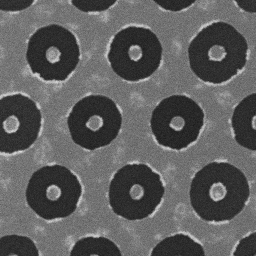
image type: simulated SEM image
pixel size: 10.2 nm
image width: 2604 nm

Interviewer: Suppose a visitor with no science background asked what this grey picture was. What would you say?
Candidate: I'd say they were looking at a regular array of ring-shaped grooves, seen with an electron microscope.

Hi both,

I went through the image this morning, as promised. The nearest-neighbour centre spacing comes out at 816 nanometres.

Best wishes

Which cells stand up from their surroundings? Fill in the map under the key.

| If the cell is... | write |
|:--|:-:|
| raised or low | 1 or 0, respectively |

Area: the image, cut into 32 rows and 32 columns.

00001111100000111111000011111100
11111111110011111111111111111110
11111111111111111111111111111111
11111000111111110011111111000111
11110000011111000000111110000011
11110000001111000000111100000001
11100010001111001100111000110001
11100010001111000000111100010001
11110000011111000000111100000011
11111000011111100001111110000111
11111111111111111111111111111111
11111111111111111111111111111111
00001111110000111111000011111100
00000111100000011110000001111000
00000111100000011110000001111000
11000111000110011110011001111000
01000111100000011110000001111000
00001111100000111111000001111000
00011111111011111111100111111110
11111111111111111111111111111111
11111111111111111111111111000111
11110000011111100001111110000011
11110000001111000000111100000001
11100010001111000100011100110001
11100010001111001100111100110001
11100000001111000000111100000001
11110000011111000001111110000011
11111111111111110111111111000111
11111111111111111111111111111111
10011111111111111111100111111110
00001111100000111111000001111100
00000111100000011110000000111000